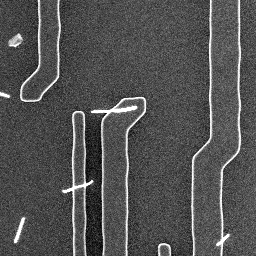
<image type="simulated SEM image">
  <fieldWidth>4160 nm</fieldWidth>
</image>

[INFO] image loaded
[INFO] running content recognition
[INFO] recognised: groups of lines, slits or small figures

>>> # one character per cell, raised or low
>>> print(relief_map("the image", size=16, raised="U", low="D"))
DDUUDDDDDDDDDUUD
DDUUDDDDDDDDDUUD
DDUUDDDDDDDDDUUD
DDUUDDDDDDDDDUUD
DDUUDDDDDDDDDUUD
DUUDDDDDDDDDDUUD
DDDDDDDUUDDDDUUD
DDDDDDUUUDDDDUUD
DDDDDDUUDDDDDUUD
DDDDDDUUDDDDUUUD
DDDDDDUUDDDDUUDD
DDDDDDUUDDDDUUDD
DDDDDDUUDDDDUUDD
DDDDDDUUDDDDUUDD
DDDDDDUUDDDDUUDD
DDDDDDUUDDDDUUDD